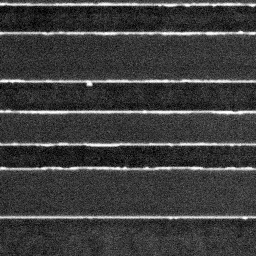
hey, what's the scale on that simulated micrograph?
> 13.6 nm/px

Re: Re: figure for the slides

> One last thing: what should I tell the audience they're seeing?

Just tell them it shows lines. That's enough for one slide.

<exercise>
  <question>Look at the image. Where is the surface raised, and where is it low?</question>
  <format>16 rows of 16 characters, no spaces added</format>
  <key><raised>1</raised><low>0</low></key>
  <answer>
0000000000000000
0000000000000000
1111111111111111
1111111111111111
1111111111111111
0000000000000000
0000000000000000
1111111111111111
1111111111111111
0000000000000000
0000000000000000
1111111111111111
1111111111111111
1111111111111111
0000000000000000
0000000000000000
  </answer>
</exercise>